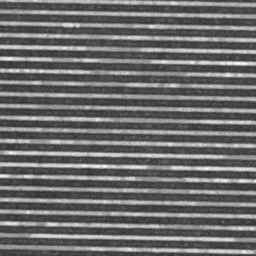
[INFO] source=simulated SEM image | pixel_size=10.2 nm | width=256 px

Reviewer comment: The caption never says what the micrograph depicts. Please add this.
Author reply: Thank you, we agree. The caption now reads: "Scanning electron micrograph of parallel lines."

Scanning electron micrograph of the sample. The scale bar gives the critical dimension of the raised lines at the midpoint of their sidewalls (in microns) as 0.0293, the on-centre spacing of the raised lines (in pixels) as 11.8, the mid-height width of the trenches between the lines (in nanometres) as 89.3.